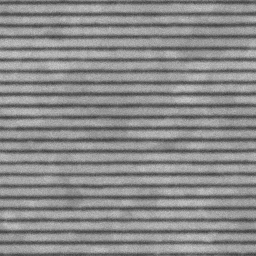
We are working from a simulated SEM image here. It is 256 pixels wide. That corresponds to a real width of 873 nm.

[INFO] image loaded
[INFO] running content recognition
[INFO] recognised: parallel lines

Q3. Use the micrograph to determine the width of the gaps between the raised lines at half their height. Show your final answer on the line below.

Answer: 12.8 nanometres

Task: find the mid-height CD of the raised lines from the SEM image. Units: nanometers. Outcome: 25.2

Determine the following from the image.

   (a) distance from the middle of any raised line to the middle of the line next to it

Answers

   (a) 39.1 nm